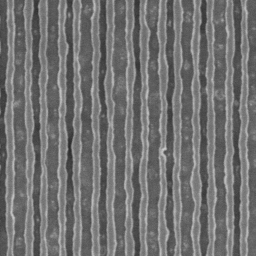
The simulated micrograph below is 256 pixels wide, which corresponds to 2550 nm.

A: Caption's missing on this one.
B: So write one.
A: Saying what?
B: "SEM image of parallel lines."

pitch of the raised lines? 0.167 um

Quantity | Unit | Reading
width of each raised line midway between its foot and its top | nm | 67.3